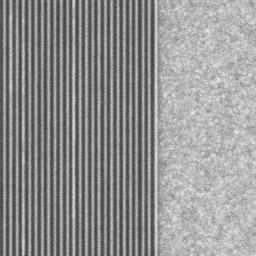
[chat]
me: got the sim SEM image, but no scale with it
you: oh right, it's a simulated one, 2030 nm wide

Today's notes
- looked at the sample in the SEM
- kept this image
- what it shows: parallel lines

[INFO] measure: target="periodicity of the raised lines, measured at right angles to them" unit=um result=0.0497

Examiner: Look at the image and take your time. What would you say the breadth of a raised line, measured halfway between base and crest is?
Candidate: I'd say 0.0149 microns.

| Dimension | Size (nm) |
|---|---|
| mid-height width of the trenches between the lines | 30.7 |